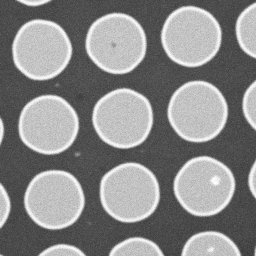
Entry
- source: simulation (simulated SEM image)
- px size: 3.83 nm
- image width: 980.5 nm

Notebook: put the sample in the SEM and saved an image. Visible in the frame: an array of small figures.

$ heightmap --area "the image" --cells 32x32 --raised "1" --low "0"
00011000000000000000000000000000
00000000000000000000001111000011
00000000000011111000011111100011
00011111000111111100111111100011
00111111000111111100111111110011
00111111100111111100111111100011
00111111100111111100011111100001
00111111100011111100001111000000
00111111000001111000000000000000
00011110000000000000000000000000
00000000000000000000000111000000
00000000000000111000001111110001
00001111000011111100011111110011
00011111100011111110011111110011
00011111110011111110011111110001
00111111110011111110011111110001
00111111110011111110001111100000
00011111100001111100000111000000
00001111000000010000000000000000
00000000000000000000000000000000
00000000000000011000000111110000
00000011000000111110001111111001
00001111100001111110001111111001
00011111110001111111001111111001
10011111110001111111001111111000
10011111110001111111000111110000
10011111110001111110000011100000
10001111100000011100000000000000
00000011000000000000000000000000
00000000000000000000000011110000
00000000000000011110000111111000
00000111110000111111000111111100